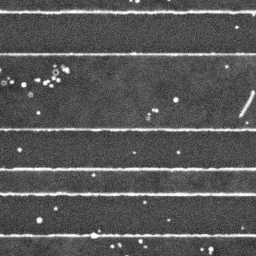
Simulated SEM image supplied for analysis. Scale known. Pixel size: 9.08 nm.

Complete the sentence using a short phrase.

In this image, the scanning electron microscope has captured lines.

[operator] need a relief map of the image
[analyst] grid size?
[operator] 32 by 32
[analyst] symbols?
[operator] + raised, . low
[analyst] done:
++++++++++++++++++++++++++++++++
++++++++++++++++++++++++++++++++
................................
................................
................................
................................
................................
++++++++++++++++++++++++++++++++
++++++++++++++++++++++++++++++++
++++++++++++++++++++++++++++++++
++++++++++++++++++++++++++++++++
++++++++++++++++++++++++++++++++
++++++++++++++++++++++++++++++++
++++++++++++++++++++++++++++++++
++++++++++++++++++++++++++++++++
++++++++++++++++++++++++++++++++
................................
................................
................................
................................
................................
++++++++++++++++++++++++++++++++
++++++++++++++++++++++++++++++++
++++++++++++++++++++++++++++++++
................................
................................
................................
................................
................................
++++..++++++++.+++++++++++++++++
++++++++++++++++++++++++++++++++
++++++++++++++++++++++++++++++++